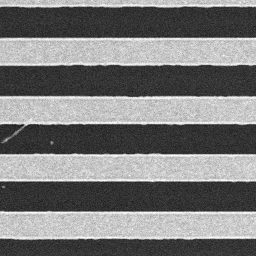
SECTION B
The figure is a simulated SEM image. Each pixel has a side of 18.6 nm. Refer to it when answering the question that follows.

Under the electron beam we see lines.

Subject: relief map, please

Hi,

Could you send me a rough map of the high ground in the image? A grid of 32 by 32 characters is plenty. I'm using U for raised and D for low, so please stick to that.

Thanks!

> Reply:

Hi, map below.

UUUUUUUUUUUUUUUUUUUUUUUUUUUUUUUU
DDDDDDDDDDDDDDDDDDDDDDDDDDDDDDDD
DDDDDDDDDDDDDDDDDDDDDDDDDDDDDDDD
DDDDDDDDDDDDDDDDDDDDDDDDDDDDDDDD
DDDDDDDDDDDDDDDDDDDDDDDDDDDDDDDD
UUUUUUUUUUUUUUUUUUUUUUUUUUUUUUUU
UUUUUUUUUUUUUUUUUUUUUUUUUUUUUUUU
UUUUUUUUUUUUUUUUUUUUUUUUUUUUUUUU
DDDDDDDDDDDDDDDDDDDDDDDDDDDDDDDD
DDDDDDDDDDDDDDDDDDDDDDDDDDDDDDDD
DDDDDDDDDDDDDDDDDDDDDDDDDDDDDDDD
DDDDDDDDDDDDDDDDDDDDDDDDDDDDDDDD
UUUUUUUUUUUUUUUUUUUUUUUUUUUUUUUU
UUUUUUUUUUUUUUUUUUUUUUUUUUUUUUUU
UUUUUUUUUUUUUUUUUUUUUUUUUUUUUUUU
DDDUDUUDUDDDDDDDDDDDDDDDDDDDDDDD
DDDDDDDDDDDDDDDDDDDDDDDDDDDDDDDD
DDDDDDDDDDDDDDDDDDDDDDDDDDDDDDDD
DDDDDDDDDDDDDDDDDDDDDDDDDDDDDDDD
UUUUUUUUUUUUUUUUUUUUUUUUUUUUUUUU
UUUUUUUUUUUUUUUUUUUUUUUUUUUUUUUU
UUUUUUUUUUUUUUUUUUUUUUUUUUUUUUUU
UUUUUUUUUUUUUUUUUUUUUUUUUUUUUUUU
DDDDDDDDDDDDDDDDDDDDDDDDDDDDDDDD
DDDDDDDDDDDDDDDDDDDDDDDDDDDDDDDD
DDDDDDDDDDDDDDDDDDDDDDDDDDDDDDDD
DDDDDDDDDDDDDDDDDDDDDDDDDDDDDDDD
UUUUUUUUUUUUUUUUUUUUUUUUUUUUUUUU
UUUUUUUUUUUUUUUUUUUUUUUUUUUUUUUU
UUUUUUUUUUUUUUUUUUUUUUUUUUUUUUUU
DDDDDDDDDDDDDDDDDDDDDDDDDDDDDDDD
DDDDDDDDDDDDDDDDDDDDDDDDDDDDDDDD